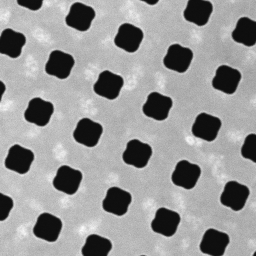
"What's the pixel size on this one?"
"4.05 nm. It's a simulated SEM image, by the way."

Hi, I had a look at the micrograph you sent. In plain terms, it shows a regular array of holes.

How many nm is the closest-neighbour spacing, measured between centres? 209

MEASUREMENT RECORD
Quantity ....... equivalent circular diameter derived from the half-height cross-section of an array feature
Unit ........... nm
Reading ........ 114